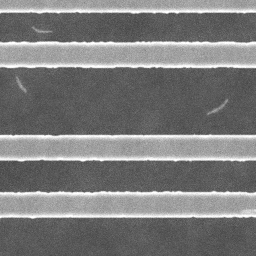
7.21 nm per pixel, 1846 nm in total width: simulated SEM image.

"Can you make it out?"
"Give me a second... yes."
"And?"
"lines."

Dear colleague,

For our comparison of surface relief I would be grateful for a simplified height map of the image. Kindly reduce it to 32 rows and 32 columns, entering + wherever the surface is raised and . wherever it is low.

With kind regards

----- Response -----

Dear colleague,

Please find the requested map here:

++++++++++++++++++++++++++++++++
....++.+..+.....++.++.+..+...++.
................................
................................
................................
++++++++++++++++++++++++++++++++
++++++++++++++++++++++++++++++++
++++++++++++++++++++++++++++++++
................................
................................
................................
................................
................................
................................
................................
................................
................................
++++++++++++++++++++++++++++++++
++++++++++++++++++++++++++++++++
++++++++++++++++++++++++++++++++
................................
................................
................................
................................
++++++++++++++++++++++++++++++++
++++++++++++++++++++++++++++++++
++++++++++++++++++++++++++++++++
................................
................................
................................
................................
................................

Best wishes